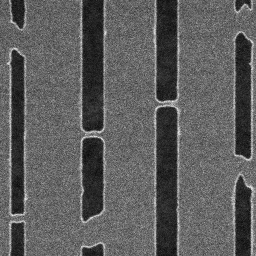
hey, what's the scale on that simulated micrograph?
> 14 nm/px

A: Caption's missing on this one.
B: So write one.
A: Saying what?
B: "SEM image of one or a few lines or trenches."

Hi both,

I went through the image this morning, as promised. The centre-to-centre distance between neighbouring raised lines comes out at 1070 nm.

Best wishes